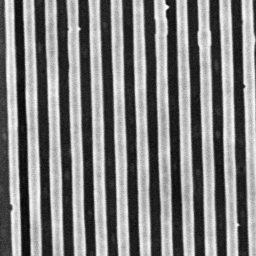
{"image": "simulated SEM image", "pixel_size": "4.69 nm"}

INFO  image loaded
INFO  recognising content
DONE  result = parallel lines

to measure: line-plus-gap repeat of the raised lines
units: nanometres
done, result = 101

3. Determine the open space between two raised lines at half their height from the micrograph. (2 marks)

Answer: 51.5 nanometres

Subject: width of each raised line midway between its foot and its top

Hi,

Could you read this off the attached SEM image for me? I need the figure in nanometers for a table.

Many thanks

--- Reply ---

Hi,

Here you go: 51.5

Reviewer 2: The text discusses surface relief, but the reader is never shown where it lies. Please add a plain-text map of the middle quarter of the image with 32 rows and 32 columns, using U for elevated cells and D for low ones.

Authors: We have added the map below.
DUUUDDDUUDDDUUUDDDUUDDDUUUDDDUUD
DUUUDDDUUDDDUUUDDDUUDDDUUUDDDUUD
DUUUDDDUUDDDUUUDDDUUDDDUUUDDDUUD
DUUUDDDUUDDDUUUDDDUUDDDUUUDDDUUD
DUUUDDDUUDDDUUUDDDUUDDDUUUDDDUUD
DUUUDDDUUDDDUUUDDDUUDDDUUUDDDUUD
DUUUDDDUUDDDUUUDDDUUDDDUUUDDDUUU
DUUUDDDUUUDDUUUDDDUUUDDUUUDDDUUU
DDUUDDDUUUDDDUUDDDUUUDDUUUDDDUUU
DDUUDDDUUUDDDUUDDDUUUDDUUUDDDUUD
DDUUDDDUUUDDDUUDDDUUUDDUUUDDDUUD
DDUUDDDUUUDDDUUDDDUUUDDUUUDDDUUD
DDUUDDDUUUDDDUUDDDUUUDDUUUDDDUUD
DDUUDDDUUUDDDUUDDDUUDDDUUUDDDUUD
DDUUDDDUUUDDDUUDDDUUUDDUUUDDDUUU
DDUUDDDUUUDDDUUDDDUUUDDDUUDDDUUU
DDUUDDDUUUDDDUUDDDUUUDDDUUDDDUUU
DDUUDDDUUUDDDUUDDDUUUDDDUUDDDUUU
DDUUDDDUUUDDDUUDDDUUUDDDUUDDDUUU
DDUUDDDUUUDDDUUDDDUUUDDDUUDDDUUU
DDUUDDDUUUDDDUUDDDUUUDDDUUDDDUUU
DDUUDDDUUUDDDUUDDDUUUDDDUUDDDUUU
DDUUDDDUUUDDDUUDDDUUUDDDUUDDDUUU
DDUUDDDUUUDDDUUDDDUUUDDDUUUDDUUU
DDUUUDDUUUDDDUUUDDDUUDDDUUUDDUUU
DDUUUDDUUUDDDUUUDDUUUDDDUUUDDUUU
DDUUUDDUUUDDDUUUDDUUUDDDUUUDDUUU
DDUUUDDUUUDDDUUUDDDUUDDDUUUDDUUU
DDUUUDDDUUDDDUUUDDDUUDDDUUUDDUUU
DDUUUDDDUUDDDUUUDDDUUDDDUUUDDUUU
DDUUUDDUUUDDDUUUDDDUUDDDUUUDDUUU
DDUUUDDUUUDDDUUUDDDUUDDDUUUDDUUU